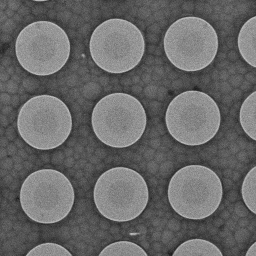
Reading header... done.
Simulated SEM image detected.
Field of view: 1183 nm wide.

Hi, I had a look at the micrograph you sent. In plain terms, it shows an array of small figures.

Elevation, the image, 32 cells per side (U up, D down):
DDDDDDDDDDDDDDDDDDDDDDDDDDDDDDDD
DDDDDDDDDDDDDDDDDDDDDDDDDDDDDDDD
DDDDDDDDDDDDDDUDDDDDDDUUUDDDDDDU
DDDUUUUUDDDDUUUUUDDDDUUUUUUDDDUU
DDUUUUUUDDDUUUUUUUDDDUUUUUUDDDUU
DDUUUUUUUDDUUUUUUUDDDUUUUUUDDDUU
DDUUUUUUUDDUUUUUUUDDDUUUUUUDDDUU
DDUUUUUUDDDDUUUUUUDDDUUUUUUDDDDU
DDDUUUUUDDDDDUUUUDDDDDUUUDDDDDDD
DDDDDDDDDDDDDDDDDDDDDDDDDDDDDDDD
DDDDDDDDDDDDDDDDDDDDDDDDDDDDDDDD
DDDDDDDDDDDDDDDDDDDDDDDUUDDDDDDD
DDDDUUUDDDDDDUUUUDDDDDUUUUUDDDDU
DDDUUUUUDDDDUUUUUUDDDUUUUUUDDDUU
DDUUUUUUUDDDUUUUUUDDDUUUUUUDDDUU
DDUUUUUUUDDDUUUUUUDDDUUUUUUDDDUU
DDUUUUUUUDDDUUUUUUDDDUUUUUUDDDDU
DDDUUUUUDDDDDUUUUDDDDDUUUUDDDDDD
DDDDDUUDDDDDDDDDDDDDDDDDDDDDDDDD
DDDDDDDDDDDDDDDDDDDDDDDDDDDDDDDD
DDDDDDDDDDDDDDDDDDDDDDDDDDDDDDDD
DDDDUUUDDDDDDUUUUDDDDDUUUUUDDDDU
DDDUUUUUDDDDUUUUUUDDDUUUUUUDDDDU
DDDUUUUUUDDDUUUUUUDDDUUUUUUUDDUU
DDDUUUUUUDDDUUUUUUDDDUUUUUUUDDUU
DDDUUUUUUDDDUUUUUUDDDUUUUUUDDDDU
DDDUUUUUUDDDDUUUUUDDDDUUUUUDDDDD
DDDDUUUUDDDDDDUUDDDDDDDDDDDDDDDD
DDDDDDDDDDDDDDDDDDDDDDDDDDDDDDDD
DDDDDDDDDDDDDDDDDDDDDDDDDDDDDDDD
DDDDDUUDDDDDDDUUUDDDDDDUUUUDDDDD
DDDDUUUUUDDDDUUUUUDDDDUUUUUUDDDU